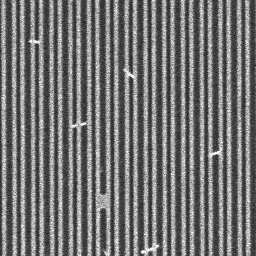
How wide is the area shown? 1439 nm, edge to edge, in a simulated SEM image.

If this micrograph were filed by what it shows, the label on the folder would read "parallel lines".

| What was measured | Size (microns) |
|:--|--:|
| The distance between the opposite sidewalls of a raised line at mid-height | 0.026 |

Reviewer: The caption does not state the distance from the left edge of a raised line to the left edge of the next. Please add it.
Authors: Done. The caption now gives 0.0527 micrometres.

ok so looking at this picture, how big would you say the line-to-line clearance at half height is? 31.6 nm